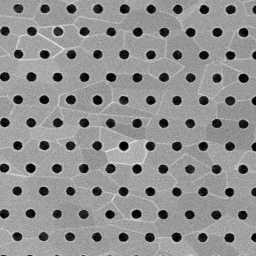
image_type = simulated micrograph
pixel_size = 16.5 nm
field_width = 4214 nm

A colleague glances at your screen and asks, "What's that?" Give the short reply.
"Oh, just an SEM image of a regular array of holes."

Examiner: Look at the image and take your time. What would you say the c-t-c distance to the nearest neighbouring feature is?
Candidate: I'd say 26.2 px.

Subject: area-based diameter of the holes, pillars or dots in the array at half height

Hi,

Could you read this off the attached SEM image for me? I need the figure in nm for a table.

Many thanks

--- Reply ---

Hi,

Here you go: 165